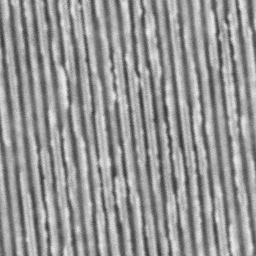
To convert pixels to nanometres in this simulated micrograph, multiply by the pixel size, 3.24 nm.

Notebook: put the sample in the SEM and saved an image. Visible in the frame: parallel lines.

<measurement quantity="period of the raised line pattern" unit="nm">38.7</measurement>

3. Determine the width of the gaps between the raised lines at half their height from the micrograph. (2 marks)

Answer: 18.1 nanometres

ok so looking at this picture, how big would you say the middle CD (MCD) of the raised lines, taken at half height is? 21.3 nm